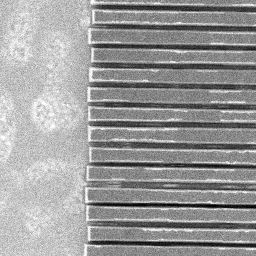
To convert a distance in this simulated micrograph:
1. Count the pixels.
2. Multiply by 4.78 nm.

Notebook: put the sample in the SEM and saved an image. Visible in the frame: parallel lines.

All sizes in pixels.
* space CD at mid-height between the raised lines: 6.13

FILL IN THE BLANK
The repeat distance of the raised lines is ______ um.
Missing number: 0.0943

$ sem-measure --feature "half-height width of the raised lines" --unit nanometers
66.3